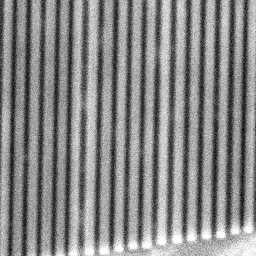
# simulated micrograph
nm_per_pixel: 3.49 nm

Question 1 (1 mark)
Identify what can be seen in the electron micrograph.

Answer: parallel lines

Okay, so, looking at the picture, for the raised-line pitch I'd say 50.1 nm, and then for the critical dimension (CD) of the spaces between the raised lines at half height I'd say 24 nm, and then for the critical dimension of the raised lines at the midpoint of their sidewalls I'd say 27.5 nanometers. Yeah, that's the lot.